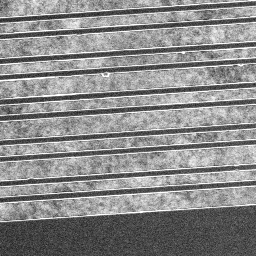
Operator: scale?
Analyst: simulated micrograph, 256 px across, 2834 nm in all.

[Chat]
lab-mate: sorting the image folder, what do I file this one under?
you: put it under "parallel lines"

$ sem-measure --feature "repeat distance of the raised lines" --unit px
19.9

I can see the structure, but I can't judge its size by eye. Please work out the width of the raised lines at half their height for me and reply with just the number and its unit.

73.2 nanometers